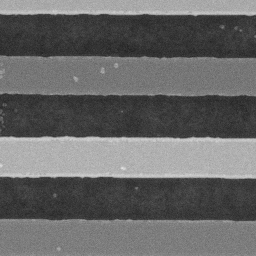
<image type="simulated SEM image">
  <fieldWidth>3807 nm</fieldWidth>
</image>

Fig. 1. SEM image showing lines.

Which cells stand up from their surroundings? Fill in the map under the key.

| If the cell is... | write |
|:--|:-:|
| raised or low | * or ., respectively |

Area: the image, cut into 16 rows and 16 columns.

****************
................
................
................
****************
****************
................
................
................
****************
****************
................
................
................
****************
****************